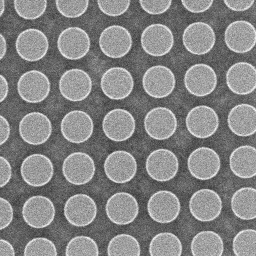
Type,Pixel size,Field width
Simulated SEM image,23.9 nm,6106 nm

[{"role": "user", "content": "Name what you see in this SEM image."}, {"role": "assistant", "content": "an array of small figures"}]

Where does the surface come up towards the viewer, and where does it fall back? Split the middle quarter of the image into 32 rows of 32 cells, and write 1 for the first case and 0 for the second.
00000000000000000000000000000000
00100000000111100000011111000001
11111100001111110000111111100011
11111100001111111000111111100011
11111110011111111000111111110011
11111110011111111000111111100001
11111110001111111000111111100001
11111100001111110000011111000000
01111000000011100000000000000000
00000000000000000000000000000000
00000000000000000000000000000000
00000000000011100000001111000000
01111100000111110000011111100001
11111110001111111000111111110001
11111110001111111100111111110001
11111110001111111100111111110001
11111110001111111000011111110001
11111110000111111000011111100000
11111100000111110000000110000000
00110000000000000000000000000000
00000000000000000000000000000000
00000000000000000000000010000000
00111000000011110000001111100000
01111110000111111000011111110001
11111110001111111100011111110001
11111111001111111100011111110001
11111111001111111100011111110001
11111110000111111100011111110000
11111110000111111000001111100000
00111100000001100000000000000000
00000000000000000000000000000000
00000000000000000000000000000000